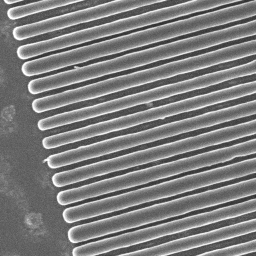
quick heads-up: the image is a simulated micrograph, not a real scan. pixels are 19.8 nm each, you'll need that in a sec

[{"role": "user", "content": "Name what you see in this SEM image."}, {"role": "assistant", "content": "parallel lines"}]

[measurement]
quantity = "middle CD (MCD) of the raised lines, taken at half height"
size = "258 nanometres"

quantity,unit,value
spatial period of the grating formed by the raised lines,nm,375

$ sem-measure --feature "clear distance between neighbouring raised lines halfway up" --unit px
6.04